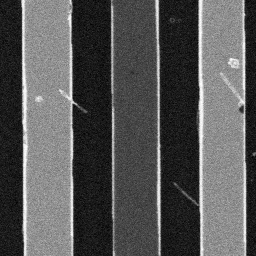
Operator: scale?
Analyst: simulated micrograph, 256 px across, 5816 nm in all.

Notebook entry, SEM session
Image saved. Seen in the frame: lines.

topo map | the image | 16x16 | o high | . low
.ooo...ooo..ooo.
.ooo...ooo..ooo.
.ooo...ooo..ooo.
.ooo...ooo...oo.
.ooo...ooo...oo.
.ooo...ooo...oo.
.oooo..ooo...oo.
.ooo...ooo...oo.
.ooo...ooo...oo.
..oo...ooo...oo.
.ooo...ooo...oo.
.oooo..ooo...oo.
..ooo..ooo...oo.
..ooo..ooo...oo.
..ooo..ooo...oo.
..ooo..ooo...oo.